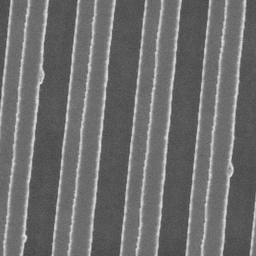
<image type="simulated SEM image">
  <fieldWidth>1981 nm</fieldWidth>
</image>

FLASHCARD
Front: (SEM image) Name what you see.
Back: lines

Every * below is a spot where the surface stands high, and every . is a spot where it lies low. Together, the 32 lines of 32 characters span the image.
.*****....****....*****...*****.
.*****....****....****....*****.
.*****....****....****....*****.
.*****...*****....****....****..
.*****...*****....****....****..
.****....*****....****....****..
.****....*****....****....****..
.****....*****...*****...*****..
.****....****....*****...*****..
.*****...****....*****...*****..
*****....****....*****...*****..
*****....****....****....*****..
*****....****....****....****...
*****...*****....****....****...
*****...*****....****....****...
****....*****....****....****...
****....*****....****....****...
****....*****...*****....****...
****....*****...*****...*****...
****....****....*****...*****...
****....****....*****...*****...
****....****....*****...*****...
****...*****....****....*****...
****...*****....****....*****...
****...*****....****....****....
***....*****....****....****....
***....*****....****....****....
***....*****...*****....****....
***....*****...*****....****....
***....****....*****....****....
***....****....*****...*****...*
***....****....*****...*****...*